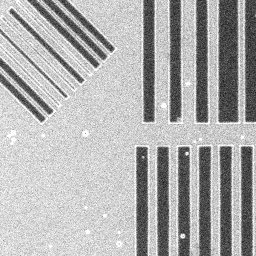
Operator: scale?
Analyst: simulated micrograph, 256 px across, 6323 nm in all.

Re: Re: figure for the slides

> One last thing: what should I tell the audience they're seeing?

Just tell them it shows groups of lines, slits or small figures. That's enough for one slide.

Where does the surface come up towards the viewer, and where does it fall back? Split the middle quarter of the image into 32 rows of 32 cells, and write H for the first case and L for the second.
HHLLHLLHHLLLLLLLLLLLHHHLLLHHHHLL
HHHLLHLLLLLLLLLLLLLLHHHLLLHHHHLL
LHHHLLHLLLLLLLLLLLLLHHHLLLHHHHLL
LLHHHLLLLLLLLLLLLLLLHHHLLLHHHLLL
HLLHHLLLLLLLLLLLLLLLHHHLLLHHHLLL
LHLLLLLLLLLLLLLLLLLLHHHLLLHHHHLL
LLHLLLLLLLLLLLLLLLLLHHHLLLHHHHLL
HLLLLLLLLLLLLLLLLLLLHHHLLLHHHHLL
HLLLLLLLLLLLLLLLLLLLHHHLLLHHHHLL
LLLLLLLLLLLLLLLLLLLLHHHLLLHHHHLL
LLLLLLLLLLLLLLLLLLLLHHHLLLHHHHLL
LLLLLLLLLLLLLLLLLLLLHHHLLLHHHHLL
LLLLLLLLLLLLLLLLLLLLHHHLLLHHHHLL
LLLLLLLLLLLLLLLLLLLLHHHLLLHHHHLL
LLLLLLLLLLLLLLLLLLLLHHHLLLHHHHLL
LLLLLLLLLLLLLLLLLLLLLLLLLLLLLLLL
LLLLLLLLLLLLLLLLLLLLLLLLLLLLLLLL
LLLLLLLLLLLLLLLLLLLLLLLLLLLLLLLL
LLLLLLLLLLLLLLLLLLLLLLLLLLLLLLLL
LLLLLLLLLLLLLLLLLLLLLLLLLLLLLLLL
LLLLLLLLLLLLLLLLLLLLLLLLLLLLLHHH
LLLLLLLLLLLLLLLLLLHHHLLHHHLLHHHH
LLLLLLLLLLLLLLLLLLHHHLLHHHLLHHHH
LLLLLLLLLLLLLLLLLLHHHLLHHHLLHHHH
LLLLLLLLLLLLLLLLLLHHHLLHHHLLHHHH
LLLLLLLLLLLLLLLLLLHHHLLHHHLLHHHH
LLLLLLLLLLLLLLLLLLHHHLLHHHLLHHHH
LLLLLLLLLLLLLLLLLLHHHLLHHHLLHHHH
LLLLLLLLLLLLLLLLLLHHHLLHHHLLHHHH
LLLLLLLLLLLLLLLLLLHHHLLHHHLLHHHH
LLLLLLLLLLLLLLLLLLHHHLLHHHLLHHHH
LLLLLLLLLLLLLLLLLLHHHLLHHHLLHHHH